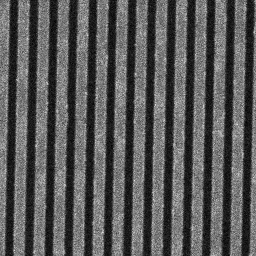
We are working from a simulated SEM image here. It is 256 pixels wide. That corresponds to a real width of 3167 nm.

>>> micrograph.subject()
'parallel lines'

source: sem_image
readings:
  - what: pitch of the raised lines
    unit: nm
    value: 244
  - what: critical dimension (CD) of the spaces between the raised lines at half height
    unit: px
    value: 8.38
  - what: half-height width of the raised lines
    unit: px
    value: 12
